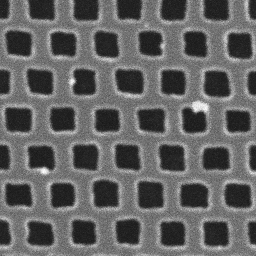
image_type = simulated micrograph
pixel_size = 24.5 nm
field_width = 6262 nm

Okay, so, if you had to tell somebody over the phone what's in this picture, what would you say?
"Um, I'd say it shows a regular array of holes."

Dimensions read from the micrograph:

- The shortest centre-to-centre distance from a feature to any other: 1050 nanometers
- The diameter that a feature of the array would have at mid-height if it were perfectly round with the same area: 688 nm